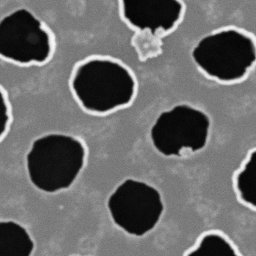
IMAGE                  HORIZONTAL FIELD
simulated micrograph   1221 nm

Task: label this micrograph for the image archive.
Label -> holes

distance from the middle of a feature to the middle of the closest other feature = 423 nm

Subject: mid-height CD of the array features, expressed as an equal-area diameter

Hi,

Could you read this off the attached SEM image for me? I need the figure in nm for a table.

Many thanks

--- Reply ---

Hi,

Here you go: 256